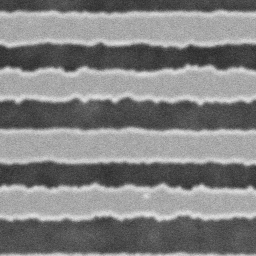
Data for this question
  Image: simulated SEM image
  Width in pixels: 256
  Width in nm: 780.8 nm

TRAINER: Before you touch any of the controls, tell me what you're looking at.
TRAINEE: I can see lines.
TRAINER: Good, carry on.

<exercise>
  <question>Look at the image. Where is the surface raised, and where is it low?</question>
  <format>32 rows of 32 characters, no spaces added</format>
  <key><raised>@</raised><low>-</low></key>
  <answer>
--------------------------------
--@---@---------@----@@-@--@@@--
@@@@@@@@@@@@@@@@@@@@@@@@@@@@@@@@
@@@@@@@@@@@@@@@@@@@@@@@@@@@@@@@@
@@@@@@@@@@@@@@@@@@@@@@@@@@@@@@@@
@@@@------@@-@@@---@@@@@@@@@----
--------------------------------
--------------------------------
----------@------------@@@@-----
@@@@@@@@@@@@@@@@@@@@@@@@@@@@@@@@
@@@@@@@@@@@@@@@@@@@@@@@@@@@@@@@@
@@@@@@@@@@@@@@@@@@@@@@@@@@@@@@@@
--@--@@@@-@---@----@@@@-@@@@@@@@
--------------------------------
--------------------------------
--------------------------------
@@@@@@@@@@@@@@@@@@@@@@@@@@@@@@@@
@@@@@@@@@@@@@@@@@@@@@@@@@@@@@@@@
@@@@@@@@@@@@@@@@@@@@@@@@@@@@@@@@
@@@@@@@@@@@@@@@@@@@@@@@@@@@@@@@@
------------------------------@@
--------------------------------
--------------------------------
@@@-@@-@@@@@@--@@@-@@---@@------
@@@@@@@@@@@@@@@@@@@@@@@@@@@@@@@@
@@@@@@@@@@@@@@@@@@@@@@@@@@@@@@@@
@@@@@@@@@@@@@@@@@@@@@@@@@@@@@@@@
--------------------------------
--------------------------------
--------------------------------
--------------------------------
--------------------------------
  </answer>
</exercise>